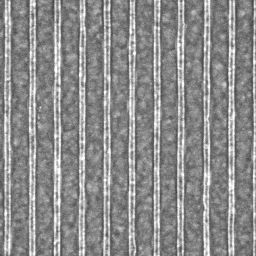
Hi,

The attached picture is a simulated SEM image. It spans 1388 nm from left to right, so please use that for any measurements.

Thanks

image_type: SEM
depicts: parallel lines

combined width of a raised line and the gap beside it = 135 nm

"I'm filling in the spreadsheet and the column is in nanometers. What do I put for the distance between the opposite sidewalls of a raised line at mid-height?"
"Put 24.4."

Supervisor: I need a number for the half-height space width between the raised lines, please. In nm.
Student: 110